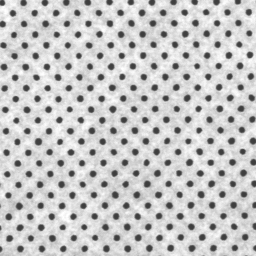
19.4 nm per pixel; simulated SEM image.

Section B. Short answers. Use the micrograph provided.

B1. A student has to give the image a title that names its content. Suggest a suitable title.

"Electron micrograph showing a regular array of holes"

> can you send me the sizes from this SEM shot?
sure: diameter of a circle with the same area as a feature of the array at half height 135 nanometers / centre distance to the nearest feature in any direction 288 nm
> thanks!